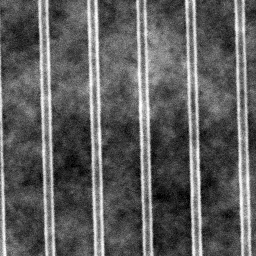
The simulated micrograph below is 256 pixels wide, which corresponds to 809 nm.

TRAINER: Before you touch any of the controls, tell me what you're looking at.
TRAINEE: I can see parallel lines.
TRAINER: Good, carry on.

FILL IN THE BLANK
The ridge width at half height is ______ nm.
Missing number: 24.9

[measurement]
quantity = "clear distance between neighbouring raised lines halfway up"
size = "0.129 micrometres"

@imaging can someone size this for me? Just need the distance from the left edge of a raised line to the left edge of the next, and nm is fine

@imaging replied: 155